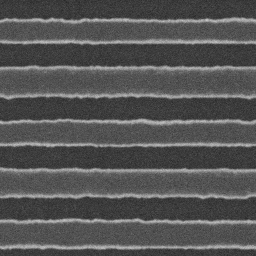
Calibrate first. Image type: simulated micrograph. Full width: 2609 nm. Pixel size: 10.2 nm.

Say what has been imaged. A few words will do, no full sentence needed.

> lines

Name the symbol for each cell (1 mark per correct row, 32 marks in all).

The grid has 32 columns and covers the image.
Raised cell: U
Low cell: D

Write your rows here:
DDDDDDDDDDDDDDDDDDDDDDDDDDDDDDDD
DDDDDDDDDDDDDDDDDDDDDDDDDDDDDDDD
UUUUUUUUDDUUUUUUUUUUDDUDDUUUUUUU
UUUUUUUUUUUUUUUUUUUUUUUUUUUUUUUU
UUUUUUUUUUUUUUUUUUUUUUUUUUUUUUUU
DDDDDDDDDDDDDDDDDDDDDDDDDDDDDDDD
DDDDDDDDDDDDDDDDDDDDDDDDDDDDDDDD
DDDDDDDDDDDDDDDDDDDDDDDDDDDDDDDD
UUUUUUUUUUUUUUUUUUUUUUUUUUUUUUUU
UUUUUUUUUUUUUUUUUUUUUUUUUUUUUUUU
UUUUUUUUUUUUUUUUUUUUUUUUUUUUUUUU
UUUUUUUUUUUUUUUUUUUUUUUUUUUUUUUU
DDDDDDDDDDDDDDDDDDDDDDDDDDDDDDDD
DDDDDDDDDDDDDDDDDDDDDDDDDDDDDDDD
DDDDDDDDDDDDDDDDDDDDDDDDDDDDDDDD
UUUUUUUUUUUUUUUUUUUUUUUUUUUUUUUU
UUUUUUUUUUUUUUUUUUUUUUUUUUUUUUUU
UUUUUUUUUUUUUUUUUUUUUUUUUUUUUUUU
DDDDDDDDDDDDDDDDDDDDDDDDDDDDDDDD
DDDDDDDDDDDDDDDDDDDDDDDDDDDDDDDD
DDDDDDDDDDDDDDDDDDDDDDDDDDDDDDDD
UUUUUUUUUUUUUUUUUUUUUUUUUUUUUUUU
UUUUUUUUUUUUUUUUUUUUUUUUUUUUUUUU
UUUUUUUUUUUUUUUUUUUUUUUUUUUUUUUU
UUUUUUUUUUUUUUUUUUUUUUUUUUUUUUUU
DDDDDDDDDDDDDDDDDDDDDDDDDDDDDDDD
DDDDDDDDDDDDDDDDDDDDDDDDDDDDDDDD
DDDDDDDDDUDDDDDDDUDDDDDDDDDDDDDD
UUUUUUUUUUUUUUUUUUUUUUUUUUUUUUUU
UUUUUUUUUUUUUUUUUUUUUUUUUUUUUUUU
UUUUUUUUUUUUUUUUUUUUUUUUUUUUUUUU
DDDDDDDDDDDDDDDDDDDDDDDDDDDDDDDD